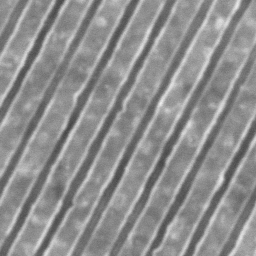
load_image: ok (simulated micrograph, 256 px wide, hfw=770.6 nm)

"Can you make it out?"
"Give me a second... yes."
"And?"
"parallel lines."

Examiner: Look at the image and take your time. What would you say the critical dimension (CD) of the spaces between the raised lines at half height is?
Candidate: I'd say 26.7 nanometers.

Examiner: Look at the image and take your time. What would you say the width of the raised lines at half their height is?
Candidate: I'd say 72.7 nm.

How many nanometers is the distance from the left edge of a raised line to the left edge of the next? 98.8